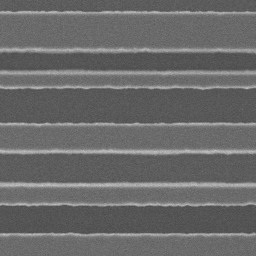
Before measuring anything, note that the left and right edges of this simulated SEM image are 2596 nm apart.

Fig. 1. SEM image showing lines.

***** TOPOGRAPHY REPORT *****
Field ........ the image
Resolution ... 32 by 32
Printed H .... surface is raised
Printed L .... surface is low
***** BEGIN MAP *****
LLLLLLLLLLLLLLLLLLLLLLLLLLLLLLLL
LLLLHHHHHLLLHHHLHLLHLLLHLLLLLLLL
HHHHHHHHHHHHHHHHHHHHHHHHHHHHHHHH
HHHHHHHHHHHHHHHHHHHHHHHHHHHHHHHH
HHHHHHHHHHHHHHHHHHHHHHHHHHHHHHHH
HHHHHHHHHHHHHHHHHHHHHHHHHHHHHHHH
LLLLLLLLLLLLLLLLLLLLLLLLLLLLLLLL
LLLLLLLLLLLLLLLLLLLLLLLLLLLLLLLL
LLLLLLLLLLLLLLLLLLLLLLLLLLLLLLLL
HHHHHHHHHHHHHHHHHHHHHHHHHHHHHHHH
HHHHHHHHHHHHHHHHHHHHHHHHHHHHHHHH
LLLLLLLLLLLLLLLLLLLLLLLLLLLLLLLL
LLLLLLLLLLLLLLLLLLLLLLLLLLLLLLLL
LLLLLLLLLLLLLLLLLLLLLLLLLLLLLLLL
LLLLLLLLLLLLLLLLLLLLLLLLLLLLLLLL
HHHHLHLHHLLHHHHLHLLLLLHHHHHHHHHH
HHHHHHHHHHHHHHHHHHHHHHHHHHHHHHHH
HHHHHHHHHHHHHHHHHHHHHHHHHHHHHHHH
HHHHHHHHHHHHHHHHHHHHHHHHHHHHHHHH
LLLLLLLLLLLLLLLLLLLLLLLLLLLLLLLL
LLLLLLLLLLLLLLLLLLLLLLLLLLLLLLLL
LLLLLLLLLLLLLLLLLLLLLLLLLLLLLLLL
LLLLLLLLLLLLLLLLLLLLLLLLLLLLLLLL
HHHHHHHHHHHHHHHHHHHHHHHHHHHHHHHH
HHHHHHHHHHHHHHHHHHHHHHHHHHHHHHHH
HHHHHHHHHHHHHHHHHHHHHHHHHHHHHHHH
LLLLLLLLLLLLLLLLLLLLLLLLLLLLLLLL
LLLLLLLLLLLLLLLLLLLLLLLLLLLLLLLL
LLLLLLLLLLLLLLLLLLLLLLLLLLLLLLLL
HHHHHHHHHHHHHHHHHHHHHHHHHHHHHHHH
HHHHHHHHHHHHHHHHHHHHHHHHHHHHHHHH
HHHHHHHHHHHHHHHHHHHHHHHHHHHHHHHH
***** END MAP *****